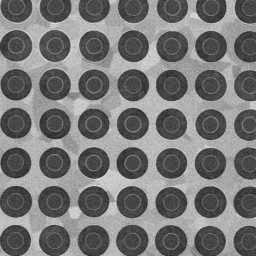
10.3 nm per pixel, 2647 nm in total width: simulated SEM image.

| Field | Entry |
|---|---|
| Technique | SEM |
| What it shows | an array of small figures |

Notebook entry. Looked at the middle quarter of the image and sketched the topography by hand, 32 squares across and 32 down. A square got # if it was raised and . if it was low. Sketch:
################################
######...#######...#######..####
.####.....####......####......##
.###...#...###..##...##...##...#
..#...###..##..####..##..####..#
..#...###..##..####..##..####..#
..##..###..###..###..##..####..#
.###.......###.......###......##
#####....######.....####......##
#################.##############
################################
#####....######....######....###
.###......####......####......##
.###..##...##...###..##...##...#
..#...###..##..####..##..####..#
..#...###...#..####..##..####..#
.###..##...##...###..##...##...#
.###.......###.......###......##
#####....######.....#####....###
################################
################################
#####.....#####....######....###
.###.......###......####......##
..##..###..##...###..##..###...#
..#...###...#..####..##..####..#
..#...###..##..####..##..####..#
.###...#...##...##...##...##...#
.####......###......####......##
######...######....######....###
################################
#######.########..##############
#####.....####......####.....###